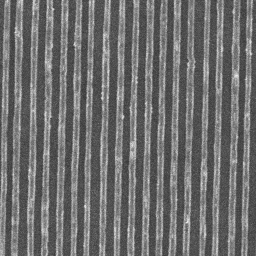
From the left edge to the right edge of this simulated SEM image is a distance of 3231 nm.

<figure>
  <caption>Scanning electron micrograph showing parallel lines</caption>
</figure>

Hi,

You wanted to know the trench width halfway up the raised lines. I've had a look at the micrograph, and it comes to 0.11 microns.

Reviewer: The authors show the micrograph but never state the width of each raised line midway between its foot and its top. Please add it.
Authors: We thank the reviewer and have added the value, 74.1 nm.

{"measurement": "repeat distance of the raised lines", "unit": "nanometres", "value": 180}